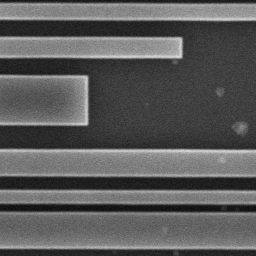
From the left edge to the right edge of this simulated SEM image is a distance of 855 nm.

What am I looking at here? groups of lines, slits or small figures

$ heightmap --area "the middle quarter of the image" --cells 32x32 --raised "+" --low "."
................................
................................
................................
++++++..........................
++++++..........................
++++++..........................
++++++..........................
++++++..........................
++++++..........................
++++++..........................
++++++..........................
++++++..........................
++++++..........................
++++++..........................
++++++..........................
................................
................................
................................
................................
................................
................................
................................
++++++++++++++++++++++++++++++++
++++++++++++++++++++++++++++++++
++++++++++++++++++++++++++++++++
++++++++++++++++++++++++++++++++
++++++++++++++++++++++++++++++++
++++++++++++++++++++++++++++++++
................................
................................
................................
................................